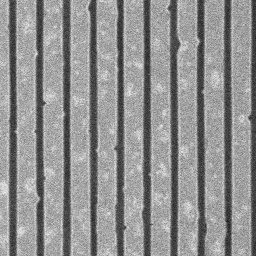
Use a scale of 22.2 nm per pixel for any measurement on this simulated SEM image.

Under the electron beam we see parallel lines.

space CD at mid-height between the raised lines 8.13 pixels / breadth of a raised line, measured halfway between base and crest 19.1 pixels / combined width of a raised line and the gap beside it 597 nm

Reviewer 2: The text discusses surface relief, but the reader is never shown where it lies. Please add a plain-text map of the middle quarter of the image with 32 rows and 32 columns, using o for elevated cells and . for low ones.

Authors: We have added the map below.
..oooo..ooooo..ooooo..oooo...ooo
..oooo..ooooo..ooooo..oooo...ooo
..oooo..ooooo..ooooo..oooo...ooo
..oooo..ooooo..ooooo..oooo...ooo
..oooo..ooooo..ooooo..oooo...ooo
..oooo..ooooo..ooooo..oooo...ooo
..oooo..ooooo..ooooo..oooo...ooo
..oooo..ooooo..ooooo..oooo...ooo
..oooo..ooooo..ooooo..oooo...ooo
..oooo..ooooo..ooooo..oooo...ooo
..oooo..ooooo..ooooo..oooo...ooo
..oooo..ooooo..ooooo..oooo...ooo
..oooo..ooooo..ooooo..oooo...ooo
..oooo..ooooo..ooooo..oooo...ooo
..oooo...oooo..ooooo..oooo...ooo
..oooo...oooo..ooooo..oooo...ooo
..oooo...oooo..ooooo..oooo...ooo
..oooo...oooo..ooooo..oooo...ooo
..oooo...oooo..ooooo..oooo...ooo
..oooo...oooo..ooooo..oooo...ooo
..oooo...oooo..ooooo..oooo...ooo
..oooo..ooooo..ooooo..oooo...ooo
..oooo..ooooo..ooooo..oooo...ooo
..oooo...oooo..ooooo..oooo...ooo
..oooo...oooo..ooooo..ooooo..ooo
..oooo...oooo..oooo...ooooo..ooo
..oooo...oooo..oooo...ooooo..ooo
..oooo...oooo..ooooo..ooooo..ooo
..oooo...oooo..ooooo..ooooo..ooo
..oooo...oooo..ooooo..ooooo..ooo
..oooo...oooo..ooooo..ooooo..ooo
..oooo...oooo..ooooo..ooooo..ooo